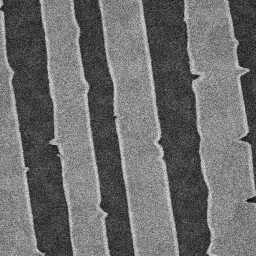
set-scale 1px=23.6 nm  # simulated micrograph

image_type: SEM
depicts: one or a few lines or trenches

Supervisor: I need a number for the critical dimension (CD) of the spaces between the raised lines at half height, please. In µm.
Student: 0.917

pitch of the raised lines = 1700 nanometers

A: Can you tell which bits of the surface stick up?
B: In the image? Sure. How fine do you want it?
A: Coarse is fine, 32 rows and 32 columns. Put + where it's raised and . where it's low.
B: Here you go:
.....++++....+++++.....+++++....
.....++++....+++++.....++++++...
.....++++....+++++.....++++++...
......++++...+++++......+++++...
......++++...+++++......+++++...
+.....++++...+++++......++++++..
+.....++++...+++++......+++++...
+.....++++....+++++.....+++++...
+.....++++....+++++.....++++++..
+.....++++....+++++......+++++..
+.....+++++...+++++.....++++++..
++.....++++...+++++.....++++++..
++.....++++...+++++......+++++..
++.....++++...+++++......+++++..
++.....++++....+++++.....++++++.
++.....++++....+++++.....++++++.
++.....++++....+++++.....++++++.
++.....++++....+++++.....+++++..
+++....++++....+++++.....++++++.
+++.....++++...+++++.....++++++.
+++.....++++...+++++.....++++++.
+++.....++++....+++++.....+++++.
+++.....++++....+++++.....++++++
+++.....++++....+++++.....++++++
+++.....++++....+++++.....++++++
++++.....+++....+++++.....++++++
++++.....++++...+++++.....++++++
++++.....++++...++++++....++++++
++++.....++++....+++++....++++++
++++.....++++....+++++.....+++++
++++.....++++....+++++....++++++
+++++....++++....+++++....++++++